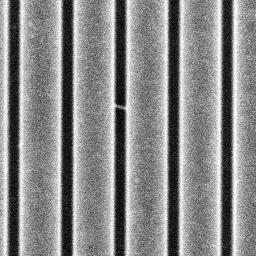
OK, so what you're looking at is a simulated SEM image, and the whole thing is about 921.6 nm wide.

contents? parallel lines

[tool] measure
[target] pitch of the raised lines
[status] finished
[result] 192 nm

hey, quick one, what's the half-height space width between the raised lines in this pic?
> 45 nm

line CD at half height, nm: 147